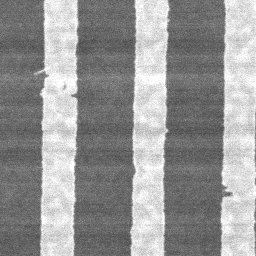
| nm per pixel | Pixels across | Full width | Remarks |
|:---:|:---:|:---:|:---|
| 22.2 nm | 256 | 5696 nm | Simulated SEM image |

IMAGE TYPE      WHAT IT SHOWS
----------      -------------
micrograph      one or a few lines or trenches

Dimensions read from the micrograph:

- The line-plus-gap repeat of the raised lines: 2010 nm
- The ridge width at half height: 690 nm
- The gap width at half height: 1320 nm